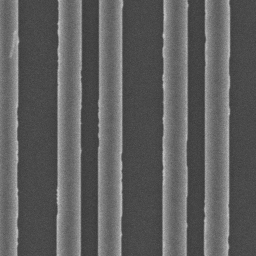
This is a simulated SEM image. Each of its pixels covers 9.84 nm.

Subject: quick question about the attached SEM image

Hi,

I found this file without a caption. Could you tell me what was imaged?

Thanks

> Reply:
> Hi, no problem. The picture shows lines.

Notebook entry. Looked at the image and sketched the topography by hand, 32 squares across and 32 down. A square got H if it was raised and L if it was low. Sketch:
HHLLLLLHHHLLHHHLLLLLLHHLLLHHHLLL
HHLLLLLHHHLLHHHLLLLLLHHLLLHHHLLL
HHLLLLLHHHLLHHHLLLLLLHHLLLHHHLLL
HHLLLLLHHHLLHHHLLLLLLHHLLLHHHLLL
HHLLLLLHHHLLHHHLLLLLHHHLLLHHHLLL
HHLLLLLHHHLLHHHLLLLLHHHLLLHHHLLL
HHLLLLLHHHLLHHHLLLLLHHHLLLHHHLLL
HHLLLLLHHHLLHHHLLLLLHHHLLLHHHLLL
HHLLLLLHHHLLHHHLLLLLLHHLLLHHHLLL
HHLLLLLHHHLLHHHLLLLLHHHLLLHHHLLL
HHLLLLLHHHLLHHHLLLLLHHHLLLHHHLLL
HHLLLLLHHHLLHHHLLLLLLHHLLLHHHLLL
HHLLLLLHHHLLHHHLLLLLLHHLLLHHHLLL
HHLLLLLHHHLLHHHLLLLLLHHLLLHHHLLL
HHLLLLLHHHLLHHHLLLLLHHHLLLHHHLLL
HHLLLLLHHHLLHHHLLLLLHHHLLLHHHLLL
HHLLLLLHHHLLHHHLLLLLLHHLLLHHHLLL
HHLLLLLHHHLLHHHLLLLLHHHLLLHHHLLL
HHLLLLLHHHLLHHHLLLLLHHHLLLHHHLLL
HHLLLLLHHHLLHHHLLLLLHHHLLLHHHLLL
HHLLLLLHHHLLHHHLLLLLHHHLLLHHHLLL
HHLLLLLHHHLLHHHLLLLLHHHLLLHHHLLL
HHLLLLLHHHLLHHHLLLLLHHHLLLHHHLLL
HHLLLLLHHHLLHHHLLLLLHHHLLLHHHLLL
HHLLLLLHHHLLHHHLLLLLHHHLLLHHHLLL
HHLLLLLHHHLLHHHLLLLLHHHLLLHHHLLL
HHLLLLLHHHLLHHHLLLLLHHHLLLHHHLLL
HHLLLLLHHHLLHHHLLLLLHHHLLLHHHLLL
HHLLLLLHHHLLHHHLLLLLHHHLLLHHHLLL
HHLLLLLHHHLLHHHLLLLLHHHLLLHHHLLL
HHLLLLLHHHLLHHHLLLLLHHHLLLHHHLLL
HHLLLLLHHHLLHHHLLLLLHHHLLLHHHLLL